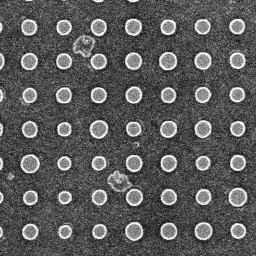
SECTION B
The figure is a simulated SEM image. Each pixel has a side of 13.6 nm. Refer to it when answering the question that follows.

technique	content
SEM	a regular array of raised bodies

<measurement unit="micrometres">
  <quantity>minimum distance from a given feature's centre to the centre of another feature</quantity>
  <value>0.463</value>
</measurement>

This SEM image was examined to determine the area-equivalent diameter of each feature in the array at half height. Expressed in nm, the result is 206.